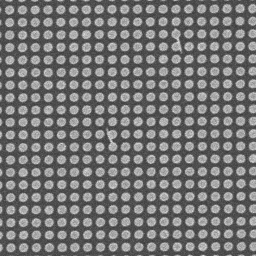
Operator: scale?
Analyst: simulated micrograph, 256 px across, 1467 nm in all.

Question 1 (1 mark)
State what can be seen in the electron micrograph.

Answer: a regular array of raised bodies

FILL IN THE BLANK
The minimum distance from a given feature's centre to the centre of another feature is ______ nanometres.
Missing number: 71.1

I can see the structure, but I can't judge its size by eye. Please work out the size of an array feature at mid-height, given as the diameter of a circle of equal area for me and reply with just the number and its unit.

49.7 nanometers